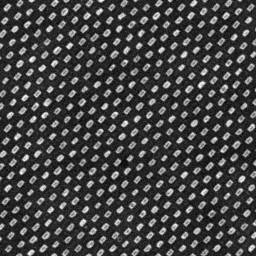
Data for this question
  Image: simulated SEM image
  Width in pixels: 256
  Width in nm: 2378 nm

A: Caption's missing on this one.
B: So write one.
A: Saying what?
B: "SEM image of a regular array of raised bodies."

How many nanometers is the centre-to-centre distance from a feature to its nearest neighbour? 118